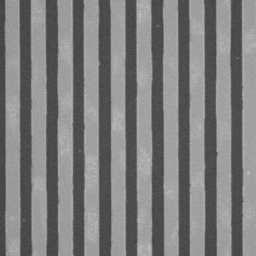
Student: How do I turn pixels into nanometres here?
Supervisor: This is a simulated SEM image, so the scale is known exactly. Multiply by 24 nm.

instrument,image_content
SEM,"parallel lines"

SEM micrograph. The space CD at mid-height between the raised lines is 309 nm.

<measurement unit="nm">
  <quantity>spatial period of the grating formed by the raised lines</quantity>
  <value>633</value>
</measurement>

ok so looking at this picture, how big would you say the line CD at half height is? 333 nanometres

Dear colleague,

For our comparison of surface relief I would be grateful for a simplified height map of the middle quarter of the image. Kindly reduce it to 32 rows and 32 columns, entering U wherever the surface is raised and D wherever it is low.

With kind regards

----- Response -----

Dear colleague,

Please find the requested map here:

UUDDDUUUUDDDUUUDDDDUUUDDDUUUDDDD
UUDDDUUUUDDDUUUDDDDUUUDDDUUUDDDD
UUDDDUUUUDDDUUUDDDDUUUDDDUUUDDDD
UUDDDUUUUDDDUUUDDDDUUUDDDUUUDDDD
UUDDDUUUUDDDUUUDDDDUUUDDDUUUDDDD
UUDDDUUUUDDDUUUDDDDUUUDDDUUUDDDD
UUDDDUUUUDDDUUUDDDDUUUDDDUUUDDDD
UUDDDUUUUDDDUUUDDDDUUUDDDUUUDDDD
UUDDDUUUUDDDUUUDDDDUUUDDDUUUDDDD
UUDDDUUUUDDDUUUDDDDUUUDDDUUUDDDD
UUDDDUUUUDDDUUUDDDDUUUDDDUUUDDDD
UUDDDUUUUDDDUUUDDDDUUUDDDUUUDDDD
UUDDDUUUUDDDUUUDDDDUUUDDDUUUDDDD
UUDDDUUUUDDDUUUDDDDUUUDDDUUUDDDD
UUDDDUUUUDDDUUUDDDUUUUDDDUUUDDDD
UUDDDUUUUDDDUUUDDDUUUUDDDUUUDDDD
UUDDDUUUUDDDUUUDDDUUUUDDDUUUDDDD
UUDDDUUUUDDDUUUDDDUUUUDDDUUUDDDD
UUDDDUUUUDDDUUUDDDUUUUDDDUUUDDDD
UUDDDUUUUDDDUUUDDDUUUUDDDUUUDDDD
UUDDDUUUUDDDUUUDDDUUUUDDDUUUDDDD
UUDDDUUUUDDDUUUDDDUUUUDDDUUUDDDD
UUDDDUUUUDDDUUUDDDUUUUDDDUUUDDDD
UUDDDUUUUDDDUUUDDDUUUUDDDUUUDDDD
UUDDDUUUUDDDUUUDDDUUUUDDDUUUDDDD
UUDDDUUUUDDDUUUDDDUUUUDDDUUUDDDD
UUDDDUUUUDDDUUUDDDDUUUDDDUUUDDDD
UUDDDUUUUDDDUUUDDDDUUUDDDUUUDDDD
UUDDDUUUUDDDUUUDDDDUUUDDDUUUDDDD
UUDDDUUUUDDDUUUDDDDUUUDDDUUUDDDD
UUDDDUUUDDDDUUUDDDDUUUDDDUUUDDDD
UUDDDUUUDDDDUUUDDDDUUUDDDUUUDDDD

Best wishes